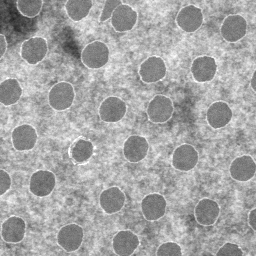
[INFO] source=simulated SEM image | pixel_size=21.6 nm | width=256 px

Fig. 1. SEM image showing a regular array of raised bodies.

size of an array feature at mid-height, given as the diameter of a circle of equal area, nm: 588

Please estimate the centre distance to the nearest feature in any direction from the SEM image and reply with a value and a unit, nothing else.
48.8 pixels